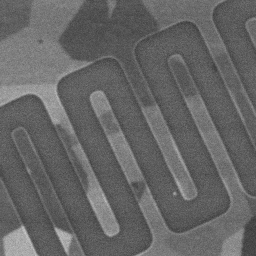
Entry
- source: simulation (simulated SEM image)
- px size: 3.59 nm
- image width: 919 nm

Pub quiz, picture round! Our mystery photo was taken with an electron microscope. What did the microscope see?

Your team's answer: groups of lines, slits or small figures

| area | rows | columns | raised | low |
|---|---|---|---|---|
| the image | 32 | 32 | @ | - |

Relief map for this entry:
@@@@@@@@@@@@@@@@@@@@@@@@@@@-----
@@@@@@@@@@@@@@@@@@@@@@@@@@@-----
@@@@@@@@@@@@@@@@@@@@@@@@@@@----@
@@@@@@@@@@@@@@@@@@@@@----@@----@
@@@@@@@@@@@@@@@@@@@------@@----@
@@@@@@@@@@@@@@@@@---------@@----
@@@@@@@@@@@@@@@@@---------@@----
@@@@@@@@@@@@---@@----@@----@@---
@@@@@@@@@@-----@@----@@----@@---
@@@@@@@@--------@@----@@----@@--
@@@@@@@---------@@----@@----@@--
@@@@@@@-----@----@@----@@----@@-
@@---@@----@@----@@----@@----@@-
------@@----@@----@@----@@----@@
------@@----@@----@@----@@----@@
-------@@----@@----@@----@@----@
--@----@@----@@----@@----@@----@
--@@----@@----@@----@@---@@@---@
--@@----@@----@@----@@----@@----
---@@----@@----@@----@----@@----
---@@----@@----@@----@@----@@---
----@@----@@----@@----@----@@---
----@@----@@----@@----@@----@@--
@----@@---@@@---@@@---@@----@@--
@----@@----@@----@@----@-----@@-
@@---@@@---@@----@@----------@@@
@@----@@----@@----@@--------@@@@
@@@---@@@---@@----@@-------@@@@@
@@@----@@----@@----@@---@@@@@@@@
@@@----@@----------@@@@@@@@@@@@@
@@@@----@@---------@@@@@@@@@@@@@
@@@@----@@--------@@@@@@@@@@@@@@